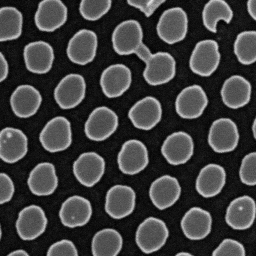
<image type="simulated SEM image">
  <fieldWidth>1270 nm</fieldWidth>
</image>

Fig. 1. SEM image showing a regular array of raised bodies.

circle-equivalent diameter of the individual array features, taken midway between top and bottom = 154 nm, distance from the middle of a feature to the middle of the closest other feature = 223 nm